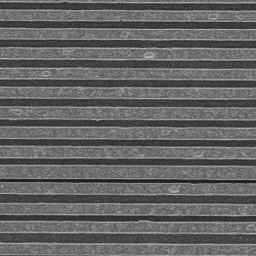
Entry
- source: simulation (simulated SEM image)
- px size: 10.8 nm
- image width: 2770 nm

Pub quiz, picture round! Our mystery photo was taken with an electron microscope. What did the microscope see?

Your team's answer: parallel lines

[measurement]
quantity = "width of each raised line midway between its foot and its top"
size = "12.1 px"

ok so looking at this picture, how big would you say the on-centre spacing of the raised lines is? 209 nm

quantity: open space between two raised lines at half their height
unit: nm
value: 85.2